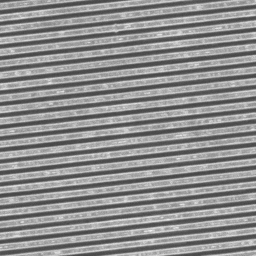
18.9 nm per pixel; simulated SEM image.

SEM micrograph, parallel lines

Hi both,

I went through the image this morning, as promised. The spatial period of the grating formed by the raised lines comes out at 216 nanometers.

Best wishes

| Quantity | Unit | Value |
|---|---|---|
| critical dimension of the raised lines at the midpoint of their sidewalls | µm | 0.122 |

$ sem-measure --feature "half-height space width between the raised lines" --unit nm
87